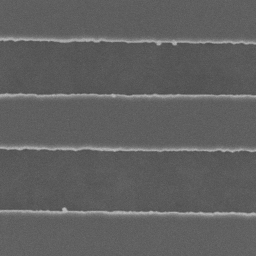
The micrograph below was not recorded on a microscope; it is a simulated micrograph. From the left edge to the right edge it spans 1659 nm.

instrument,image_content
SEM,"lines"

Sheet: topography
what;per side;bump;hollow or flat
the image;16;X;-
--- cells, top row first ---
XXXXXXXXXXXXXXXX
XXXXXXXXXXXXXXXX
XXXXXXXXXXXXXXXX
----------------
----------------
----------------
XXXXXXXXXXXXXXXX
XXXXXXXXXXXXXXXX
XXXXXXXXXXXXXXXX
----------------
----------------
----------------
----------------
XXXXXXXXXXXXXXXX
XXXXXXXXXXXXXXXX
XXXXXXXXXXXXXXXX